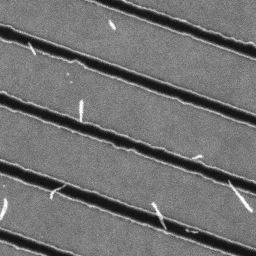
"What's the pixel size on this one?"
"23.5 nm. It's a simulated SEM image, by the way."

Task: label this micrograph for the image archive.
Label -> one or a few lines or trenches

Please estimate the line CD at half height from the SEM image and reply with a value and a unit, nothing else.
0.302 um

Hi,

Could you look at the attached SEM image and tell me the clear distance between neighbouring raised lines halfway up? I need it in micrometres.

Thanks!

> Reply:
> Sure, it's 1.19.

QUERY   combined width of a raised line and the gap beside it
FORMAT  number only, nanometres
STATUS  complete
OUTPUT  1500